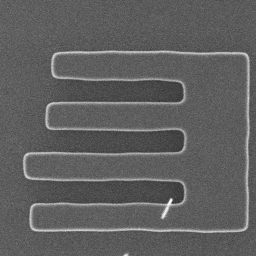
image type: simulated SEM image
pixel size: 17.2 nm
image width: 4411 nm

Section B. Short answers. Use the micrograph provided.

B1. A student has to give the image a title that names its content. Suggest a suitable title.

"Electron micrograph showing groups of lines, slits or small figures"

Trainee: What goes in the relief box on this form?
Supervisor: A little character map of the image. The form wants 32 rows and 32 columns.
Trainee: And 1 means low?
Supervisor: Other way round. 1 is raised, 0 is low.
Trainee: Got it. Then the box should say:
00000000000000000000000000000000
00000000000000000000000000000000
00000000000000000000000000000000
00000000000000000000000000000000
00000000000000000000000000000000
00000000000000000000000000000000
00000000000001100000100000000000
00000001111111111111111111111110
00000001111111111111111111111110
00000001111111111111111111111110
00000000000000000000000111111110
00000000000000000000000111111110
00000000000000000000000111111110
00000011111111111111111111111110
00000011111111111111111111111110
00000011111111111111111111111110
00000000000000000000000111111110
00000000000000000000000111111110
00000000000000000000000111111110
00011111111111111111111111111110
00011111111111111111111111111110
00011111111111111111111111111110
00000011111111000001111111111110
00000000000000000000000111111110
00000000000000000000000111111110
00000001100000001110011111111110
00001111111111111111111111111110
00001111111111111111111111111110
00001111111111111111111111111110
00000000000000000000000000000000
00000000000000000000000000000000
00000000000000000000000000000000